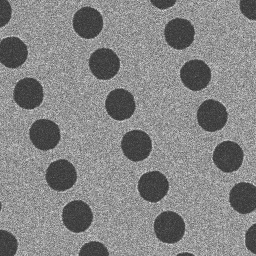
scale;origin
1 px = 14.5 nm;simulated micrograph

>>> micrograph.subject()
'a regular array of holes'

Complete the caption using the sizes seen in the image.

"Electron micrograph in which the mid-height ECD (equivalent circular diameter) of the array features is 462 nm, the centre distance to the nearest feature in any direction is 637 nanometres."